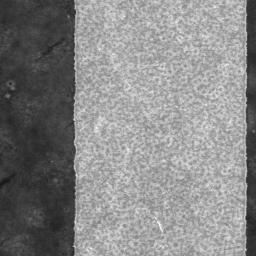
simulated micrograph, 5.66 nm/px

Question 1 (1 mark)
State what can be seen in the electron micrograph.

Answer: one or a few lines or trenches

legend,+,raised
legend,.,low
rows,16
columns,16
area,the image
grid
.....++++++++++.
.....++++++++++.
.....++++++++++.
.....++++++++++.
.....++++++++++.
.....++++++++++.
.....++++++++++.
.....++++++++++.
.....++++++++++.
.....++++++++++.
.....++++++++++.
.....++++++++++.
.....++++++++++.
.....++++++++++.
.....++++++++++.
.....++++++++++.